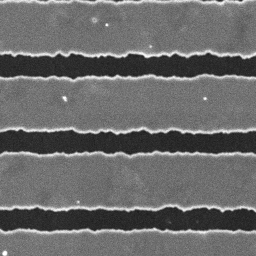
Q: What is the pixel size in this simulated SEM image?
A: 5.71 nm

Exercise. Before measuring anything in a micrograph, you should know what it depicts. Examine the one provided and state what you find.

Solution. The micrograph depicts lines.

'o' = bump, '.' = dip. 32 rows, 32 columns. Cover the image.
oooooooooooooooooooooooooooooooo
oooooooooooooooooooooooooooooooo
oooooooooooooooooooooooooooooooo
oooooooooooooooooooooooooooooooo
oooooooooooooooooooooooooooooooo
oooooooooooooooooooooooooooooooo
oooooooooooooooooooooooooooooooo
................................
................................
..o...o....o..o..ooo....ooooooo.
oooooooooooooooooooooooooooooooo
oooooooooooooooooooooooooooooooo
oooooooooooooooooooooooooooooooo
oooooooooooooooooooooooooooooooo
oooooooooooooooooooooooooooooooo
oooooooooooooooooooooooooooooooo
..........ooo.oo...oo..oooooo.o.
................................
................................
oooooooooooooooooooooooooooooooo
oooooooooooooooooooooooooooooooo
oooooooooooooooooooooooooooooooo
oooooooooooooooooooooooooooooooo
oooooooooooooooooooooooooooooooo
oooooooooooooooooooooooooooooooo
oooooooooooooooooooooooooooooooo
................................
................................
................................
oooooooooooooooooooooooooooooooo
oooooooooooooooooooooooooooooooo
oooooooooooooooooooooooooooooooo